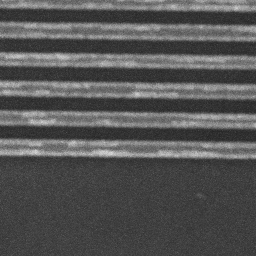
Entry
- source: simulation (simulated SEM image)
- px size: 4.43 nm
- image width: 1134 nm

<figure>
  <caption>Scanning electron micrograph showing parallel lines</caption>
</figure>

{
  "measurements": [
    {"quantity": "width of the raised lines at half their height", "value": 57.1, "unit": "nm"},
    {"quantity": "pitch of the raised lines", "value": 130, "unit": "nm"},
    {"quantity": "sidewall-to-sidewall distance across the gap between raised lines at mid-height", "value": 77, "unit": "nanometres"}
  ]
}